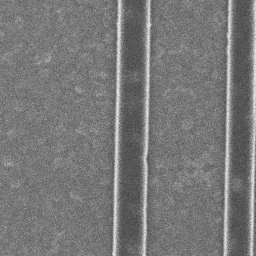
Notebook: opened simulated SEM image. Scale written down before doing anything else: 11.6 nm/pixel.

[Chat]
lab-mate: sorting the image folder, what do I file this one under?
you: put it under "one or a few lines or trenches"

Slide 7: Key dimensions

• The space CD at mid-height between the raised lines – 929 nm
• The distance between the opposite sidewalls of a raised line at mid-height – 351 nm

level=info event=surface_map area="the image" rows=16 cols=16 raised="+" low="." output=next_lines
.......++.....++
.......++.....++
.......++.....++
.......++.....++
.......++.....++
.......++.....++
.......++.....++
.......++.....++
.......++.....++
.......++.....++
.......++.....++
.......++.....++
.......++.....++
.......++.....++
.......++.....++
.......++.....++